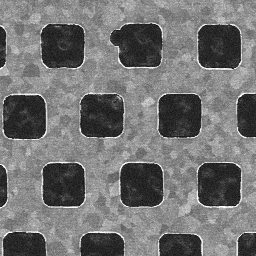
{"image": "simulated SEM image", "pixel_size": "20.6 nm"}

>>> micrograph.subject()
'a regular array of holes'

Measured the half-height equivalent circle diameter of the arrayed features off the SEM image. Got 994 nm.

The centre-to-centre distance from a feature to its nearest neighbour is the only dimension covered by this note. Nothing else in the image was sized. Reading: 1600 nm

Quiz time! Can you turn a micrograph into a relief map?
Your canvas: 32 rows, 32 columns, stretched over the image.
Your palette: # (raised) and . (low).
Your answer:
################################
################################
################################
#####.....#####.....#####.....##
.####......###......#####.....##
.####......###......#####.....##
.####......####.....#####.....##
.####.....#####.....#####.....##
##########################...###
################################
################################
################################
#....#####.....#####.....#####..
......####.....#####.....#####..
......####......####.....#####..
......####......####.....#####..
......####.....#####.....#####..
################################
################################
################################
######....######....#####....###
.####......####.....#####.....##
.####......####.....#####.....##
.####......####.....#####.....##
.####......####.....#####.....##
.#####....#####.....#####.....##
################################
################################
################################
#....#####.....#####.....#####..
......####......####.....#####..
......####......####.....#####..